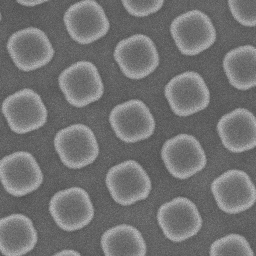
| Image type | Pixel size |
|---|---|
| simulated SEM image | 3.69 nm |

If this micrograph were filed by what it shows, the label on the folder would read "a regular array of raised bodies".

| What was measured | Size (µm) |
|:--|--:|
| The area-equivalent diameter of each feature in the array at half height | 0.152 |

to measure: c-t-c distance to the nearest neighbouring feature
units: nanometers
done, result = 227